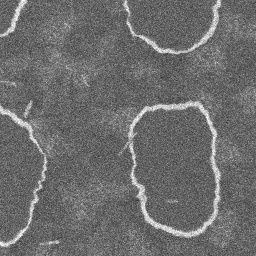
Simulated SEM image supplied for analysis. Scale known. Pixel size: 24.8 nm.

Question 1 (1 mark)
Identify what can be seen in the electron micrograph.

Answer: raised bodies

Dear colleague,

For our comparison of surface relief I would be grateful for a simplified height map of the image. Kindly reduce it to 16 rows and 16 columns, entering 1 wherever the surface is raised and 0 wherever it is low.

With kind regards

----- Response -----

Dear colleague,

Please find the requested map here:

1000000011111100
1000000011111000
0000000001111000
0000000000000000
0000000000000000
0000000000000000
0000000000000000
1000000001111000
1100000011111000
1110000011111000
1110000011111000
1110000001111100
1100000001111100
1100000001111000
1000000000010000
0000000000000000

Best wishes